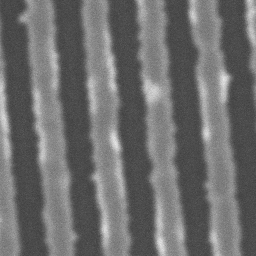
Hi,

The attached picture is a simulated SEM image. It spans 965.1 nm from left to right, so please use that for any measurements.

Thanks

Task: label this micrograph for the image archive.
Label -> parallel lines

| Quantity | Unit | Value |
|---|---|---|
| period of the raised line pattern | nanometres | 208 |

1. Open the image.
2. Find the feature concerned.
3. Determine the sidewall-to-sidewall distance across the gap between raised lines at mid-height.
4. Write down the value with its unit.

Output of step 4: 116 nanometers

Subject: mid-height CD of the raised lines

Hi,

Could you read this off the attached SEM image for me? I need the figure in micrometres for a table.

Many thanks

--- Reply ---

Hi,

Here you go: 0.0942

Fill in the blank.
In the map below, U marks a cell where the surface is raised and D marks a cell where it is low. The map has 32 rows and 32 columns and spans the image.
DDDDUUDDDDDUUDDDDUUUDDDDUUUDDDDU
DDDUUUUDDDUUUDDDDUUUDDDDUUUDDDDU
DDDUUUUDDDUUUDDDDUUUUDDDUUUDDDDU
DDDDUUUDDDDUUDDDDDUUDDDDUUUDDDDU
DDDDUUUDDDDUUUDDDUUUUDDDUUUDDDDU
DDDDUUUDDDDUUUDDDDUUUDDDDUUDDDDD
DDDDUUUDDDDUUUDDDDUUUDDDDUUUDDDD
DDDDUUUDDDDUUUDDDDUUUDDDDUUUDDDD
DDDDUUUDDDDUUUDDDDUUUDDDDUUUDDDD
DDDDUUUDDDDUUUDDDDUUUDDDDUUUUDDD
DDDDUUUDDDDUUUDDDDUUUDDDDUUUDDDD
DDDDUUUDDDDUUUDDDDUUUDDDDUUUDDDD
UDDDUUUDDDDUUUUDDDUUUDDDDUUUDDDD
UDDDUUUDDDDUUUUDDDDUUDDDDUUUDDDD
UDDDDUUUDDDUUUUDDDUUUDDDDUUUDDDD
UDDDDUUUDDDDUUUDDDDUUUDDDDUUUDDD
UDDDDUUUDDDUUUUDDDDUUUDDDUUUUDDD
UDDDDUUUDDDDUUUDDDDUUUDDDDUUUDDD
UDDDDUUUDDDDUUUDDDDUUUDDDDUUUDDD
UDDDDUUUDDDDUUUDDDDUUUDDDDUUUDDD
UDDDDUUUDDDDUUUDDDDUUUDDDDUUUDDD
UDDDDUUUDDDDUUUDDDDUUUDDDDUUUDDD
UUDDDUUUUDDDUUUDDDDUUUDDDDUUUDDD
UUDDDDUUDDDDUUUDDDDUUUDDDDUUUDDD
UUDDDDUUUDDDUUUUDDDDUUDDDDUUUDDD
UUDDDDUUUDDDUUUUDDDDUUDDDDUUUUDD
UUDDDDUUUDDDDUUUDDDDUUDDDDUUUUDD
UUDDDDUUUDDDDUUUDDDDUUUDDDUUUUDD
UUDDDDUUUDDDDUUUDDDDUUUDDDUUUUDD
UUDDDDUUUDDDDUUUDDDDUUUDDDUUUUDD
UUDDDDUUUDDDDUUUDDDDUUUDDDDUUUDD
UUDDDDUUUDDDDUUUDDDDUUUDDDDUUUDD